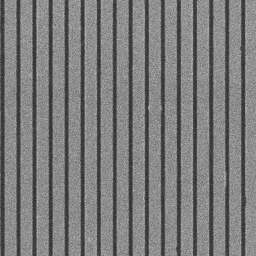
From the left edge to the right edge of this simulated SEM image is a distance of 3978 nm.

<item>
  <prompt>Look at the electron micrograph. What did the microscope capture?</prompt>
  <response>parallel lines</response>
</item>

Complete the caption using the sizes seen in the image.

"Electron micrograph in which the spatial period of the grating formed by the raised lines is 249 nm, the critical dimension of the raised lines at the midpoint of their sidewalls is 186 nm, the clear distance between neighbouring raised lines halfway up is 66 nanometres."